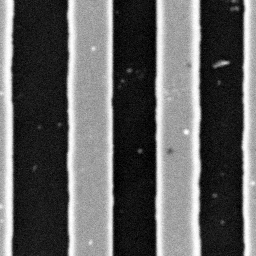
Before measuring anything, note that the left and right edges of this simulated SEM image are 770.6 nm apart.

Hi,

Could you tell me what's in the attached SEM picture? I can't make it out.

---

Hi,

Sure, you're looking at lines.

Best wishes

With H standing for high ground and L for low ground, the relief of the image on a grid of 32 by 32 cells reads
HHLLLLLLLHHHHHLLLLLLHHHHHLLLLLLH
HHLLLLLLLHHHHHLLLLLLHHHHHLLLLLLH
HHLLLLLLLHHHHHLLLLLLHHHHHLLLLLLH
HHLLLLLLLHHHHHLLLLLLHHHHHLLLLLLH
HLLLLLLLLHHHHHLLLLLLHHHHHLLLLLLH
HLLLLLLLLHHHHHLLLLLLHHHHHLLLLLLH
HLLLLLLLLHHHHHLLLLLLHHHHHLLLLLLH
HLLLLLLLLHHHHHLLLLLLHHHHHLLLLLLH
HLLLLLLLLHHHHHLLLLLLHHHHHLLLLLLH
HLLLLLLLLHHHHHLLLLLLHHHHHLLLLLLH
HLLLLLLLHHHHHHLLLLLLHHHHHLLLLLLH
HLLLLLLLLHHHHHLLLLLLHHHHHLLLLLLH
HLLLLLLLLHHHHHLLLLLLHHHHHLLLLLLH
HHLLLLLLLHHHHHLLLLLLHHHHHLLLLLLH
HHLLLLLLLHHHHHLLLLLLHHHHHLLLLLLH
HLLLLLLLLHHHHHLLLLLLHHHHHLLLLLLH
HLLLLLLLLHHHHHLLLLLLHHHHHLLLLLLH
HHLLLLLLLHHHHHLLLLLLHHHHHLLLLLHH
HHLLLLLLLHHHHHLLLLLLHHHHHLLLLLHH
HLLLLLLLLHHHHHLLLLLLHHHHHLLLLLLH
HHLLLLLLHHHHHHLLLLLLHHHHHLLLLLLH
HHLLLLLLLHHHHHLLLLLLHHHHHLLLLLLH
HHLLLLLLLHHHHHLLLLLLHHHHHLLLLLLH
HHLLLLLLLHHHHHLLLLLLHHHHHLLLLLLH
HLLLLLLLLHHHHHLLLLLLHHHHHLLLLLLH
HLLLLLLLLHHHHHLLLLLLHHHHHLLLLLLH
HLLLLLLLLHHHHHLLLLLLHHHHHLLLLLLH
HLLLLLLLLHHHHHLLLLLLHHHHHLLLLLLH
HHLLLLLLLHHHHHLLLLLLHHHHHLLLLLLH
HLLLLLLLLHHHHHLLLLLLHHHHHLLLLLLH
HLLLLLLLLHHHHHLLLLLLHHHHHLLLLLLH
HLLLLLLLLHHHHHLLLLLLHHHHHLLLLLLH